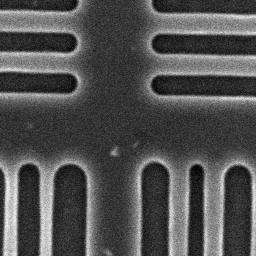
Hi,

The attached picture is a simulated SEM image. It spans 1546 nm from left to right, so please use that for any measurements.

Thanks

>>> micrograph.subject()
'groups of lines, slits or small figures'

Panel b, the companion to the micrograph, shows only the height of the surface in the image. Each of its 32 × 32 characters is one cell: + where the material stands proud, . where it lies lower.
..........+++++++++.............
+++++....+++++++++++............
++++++++++++++++++++++++++++++++
++++++++++++++++++++++++++++++++
.........++++++++++.............
..........+++++++++.............
.........++++++++++.............
++++++++++++++++++++++++++++++++
++++++++++++++++++++++++++++++++
.........++++++++++.............
..........+++++++++.............
.........++++++++++.............
++++++++++++++++++++++++++++++++
++++++++++++++++++++++++++++++++
++++++++++++++++++++++++++++++++
++++++++++++++++++++++++++++++++
++++++++++++++++++++++++++++++++
++++++++++++++++++++++++++++++++
++++++++++++++++++++++++++++++++
++++++++++++++++++++++++++++++++
+++.++++.+++++++++..++++.+++++++
++...++....+++++++...+++..++...+
.+...++....++++++....+++..++....
.+...++....++++++....+++..++....
.+...++....+++++++...+++..++....
.+...++....+++++++...++...++....
.+...+.....+++++++...++...++....
.+...+.....+++++++...++...++....
.+...+.....+++++++...++...++....
.+...+.....+++++++...++...++....
.+...+.....+++++++...++...++....
.+...+.....++++++....++...++...+